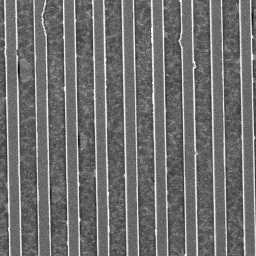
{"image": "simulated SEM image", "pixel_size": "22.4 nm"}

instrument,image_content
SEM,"parallel lines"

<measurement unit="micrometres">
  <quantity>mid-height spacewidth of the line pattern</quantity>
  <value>0.405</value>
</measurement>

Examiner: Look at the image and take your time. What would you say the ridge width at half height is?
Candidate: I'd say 263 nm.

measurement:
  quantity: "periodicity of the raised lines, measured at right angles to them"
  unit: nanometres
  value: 656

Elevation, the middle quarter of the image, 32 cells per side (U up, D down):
UUUDDDDDUUDDDDDUUUDDDDUUUDDDDDUU
UUUDDDDDUUDDDDDUUUDDDDUUUDDDDDUU
UUUDDDDDUUDDDDDUUUDDDDUUUDDDDDUU
UUUDDDDDUUDDDDDUUUDDDDUUUDDDDDUU
UUUDDDDDUUDDDDDUUUDDDDUUUDDDDDUU
UUUDDDDDUUDDDDDUUUDDDDUUUDDDDDUU
UUUDDDDDUUDDDDDUUUDDDDUUUDDDDDUU
UUUDDDDDUUDDDDDUUUDDDDUUUDDDDDUU
UUUDDDDDUUDDDDDUUUDDDDUUUDDDDDUU
UUUDDDDDUUDDDDDUUUDDDDUUUDDDDDUU
UUUDDDDDUUDDDDDUUUDDDDUUUDDDDDUU
UUUDDDDDUUDDDDDUUUDDDDUUUDDDDDUU
UUUDDDDDUUDDDDDUUUDDDDDUUDDDDDUU
DUUDDDDDUUDDDDDUUUDDDDDUUDDDDDUU
DUUDDDDDUUUDDDDUUUDDDDDUUDDDDDUU
DUUDDDDDUUUDDDDUUUDDDDDUUDDDDDUU
DUUDDDDDUUUDDDDUUUDDDDDUUDDDDDUU
DUUDDDDDUUUDDDDUUUDDDDDUUDDDDDUU
DUUDDDDDUUUDDDDUUUDDDDDUUDDDDDUU
DUUDDDDDUUUDDDDUUUDDDDDUUDDDDDUU
DUUDDDDDUUUDDDDUUUDDDDDUUDDDDDUU
DUUDDDDDUUUDDDDUUUDDDDDUUDDDDDUU
DUUDDDDDUUUDDDDUUUDDDDDUUDDDDDUU
DUUDDDDDUUUDDDDUUUDDDDDUUDDDDDUU
DUUDDDDDUUUDDDDUUUDDDDDUUDDDDDUU
DUUDDDDDUUUDDDDDUUDDDDDUUDDDDDUU
DUUDDDDDUUUDDDDDUUDDDDDUUUDDDDUU
DUUUDDDDUUUDDDDDUUDDDDDUUUDDDDUU
DUUUDDDDUUUDDDDDUUDDDDDUUUDDDDUU
DUUUDDDDUUUDDDDDUUDDDDDUUUDDDDUU
DUUUDDDDUUUDDDDDUUDDDDDUUUDDDDUU
DUUUDDDDUUUDDDDDUUDDDDDUUUDDDDUU